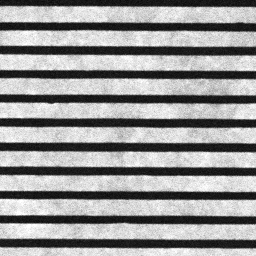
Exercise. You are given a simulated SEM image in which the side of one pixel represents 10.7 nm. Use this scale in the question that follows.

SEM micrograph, parallel lines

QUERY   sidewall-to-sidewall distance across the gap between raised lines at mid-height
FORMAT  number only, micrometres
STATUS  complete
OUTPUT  0.0893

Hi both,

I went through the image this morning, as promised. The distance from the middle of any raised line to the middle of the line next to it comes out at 257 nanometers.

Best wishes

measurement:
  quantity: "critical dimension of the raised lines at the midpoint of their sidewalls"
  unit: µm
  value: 0.169